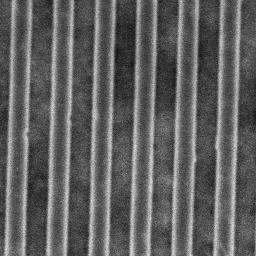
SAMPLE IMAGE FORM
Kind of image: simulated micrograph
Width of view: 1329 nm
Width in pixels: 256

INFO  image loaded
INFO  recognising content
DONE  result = parallel lines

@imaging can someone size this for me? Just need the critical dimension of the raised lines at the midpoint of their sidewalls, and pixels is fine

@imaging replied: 19.1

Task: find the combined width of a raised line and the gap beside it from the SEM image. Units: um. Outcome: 0.217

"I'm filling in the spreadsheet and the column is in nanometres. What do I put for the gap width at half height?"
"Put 118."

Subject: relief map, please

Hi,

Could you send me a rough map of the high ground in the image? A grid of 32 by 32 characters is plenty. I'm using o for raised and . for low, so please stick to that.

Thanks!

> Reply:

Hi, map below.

..oo...oo...oo...oo...ooo...oo..
..oo...oo...oo...ooo..ooo...oo..
..oo...oo...oo...ooo..ooo...oo..
..oo...oo...oo...ooo..ooo..ooo..
.ooo...oo...oo...oo...ooo..ooo..
.ooo...oo...oo...oo...ooo..ooo..
.ooo...oo...oo...oo...ooo..ooo..
.ooo...oo...oo...oo...ooo..ooo..
.ooo...oo...oo...oo...ooo..ooo..
.ooo...oo...oo...oo...oo...ooo..
.ooo...oo...oo...oo...oo...ooo..
.ooo...oo...oo...oo...oo...ooo..
.ooo..ooo...oo...oo...oo...ooo..
.ooo..ooo...oo...oo...oo...ooo..
.oo...ooo...oo...oo...oo...ooo..
.oo...ooo...oo...oo...oo...ooo..
.oo...ooo...oo...oo...oo...ooo..
.oo...ooo...oo...oo...oo...oo...
.oo...ooo...oo...oo...oo...oo...
.oo...ooo...oo...oo...oo...oo...
.oo...ooo...oo...oo...oo...oo...
.oo...ooo..ooo...oo...oo...oo...
.oo...ooo..ooo...oo...oo...oo...
.oo...oo...ooo...oo...oo...oo...
.oo...oo...ooo...oo...oo...oo...
.oo...oo...ooo..ooo...oo...oo...
.oo...oo...ooo..ooo...oo...oo...
.oo...oo...ooo..ooo...oo...oo...
.oo...oo...ooo..ooo...oo...oo...
.oo...oo...ooo..ooo...oo...oo...
.oo...oo...ooo..ooo...oo...oo...
.oo...oo...oo...ooo...oo...oo...